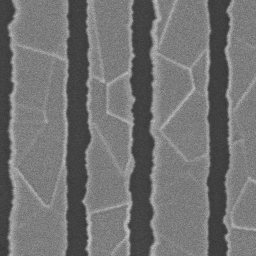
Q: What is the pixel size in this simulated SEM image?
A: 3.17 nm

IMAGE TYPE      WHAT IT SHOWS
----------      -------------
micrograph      lines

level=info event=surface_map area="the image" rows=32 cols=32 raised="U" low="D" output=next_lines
DDUUUUUUDDDUUUUUUDDUUUUUUUDDDUUU
DDUUUUUUDDDUUUUUDDDUUUUUUUDDUUUU
DDUUUUUUDDDUUUUUUDDUUUUUUUDDDUUU
DUUUUUUUDDDUUUUUDDDUUUUUUUDDDUUU
DUUUUUUUUDDUUUUUDDDUUUUUUUDDUUUU
DUUUUUUUDDDUUUUUDDDUUUUUUUDDUUUU
DUUUUUUUDDDUUUUUUDDUUUUUUUDDUUUU
DUUUUUUUDDDUUUUUUDDUUUUUUUDDUUUU
DUUUUUUUDDDUUUUUDDDUUUUUUUDDDUUU
DUUUUUUUDDDUUUUUDDDUUUUUUUDDDUUU
DDUUUUUUDDDUUUUUDDDUUUUUUUDDDUUU
DUUUUUUUDDDUUUUUDDDUUUUUUUDDUUUU
DUUUUUUUDDDUUUUUUDDUUUUUUUDDUUUU
DUUUUUUUDDDUUUUUDDDUUUUUUUDDDUUU
DUUUUUUUDDDUUUUUUDDUUUUUUUDDDUUU
DUUUUUUUDDDUUUUUUDDUUUUUUUDDDUUU
DUUUUUUUDDDUUUUUDDDUUUUUUUDDDUUU
DUUUUUUUDDDUUUUUUDDUUUUUUUDDDUUU
DUUUUUUUDDDUUUUUDDDUUUUUUUDDDUUU
DUUUUUUUDDDUUUUUUDDUUUUUUUDDDUUU
DUUUUUUUDDDUUUUUUDDUUUUUUUDDDUUU
DUUUUUUUDDDUUUUUDDDUUUUUUUDDUUUU
DUUUUUUUDDDUUUUUDDDUUUUUUUDDUUUU
DDUUUUUUDDDUUUUUDDDUUUUUUUDDUUUU
DDUUUUUUDDDUUUUUDDDUUUUUUUDDUUUU
DUUUUUUUDDUUUUUUDDDUUUUUUUDDUUUU
DUUUUUUUDDDUUUUUDDDUUUUUUUDDUUUU
DUUUUUUUDDDUUUUUDDDUUUUUUUDDUUUU
DUUUUUUUDDDUUUUUDDDUUUUUUUDDUUUU
DUUUUUUUDDDUUUUUDDDUUUUUUUDDUUUU
DUUUUUUUDDDUUUUUDDDUUUUUUUDDUUUU
DUUUUUUUDDDUUUUUDDDUUUUUUUDDUUUU